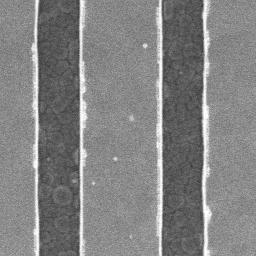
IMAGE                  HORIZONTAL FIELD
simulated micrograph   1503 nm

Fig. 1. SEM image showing one or a few lines or trenches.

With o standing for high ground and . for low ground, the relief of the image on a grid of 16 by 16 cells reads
oo...ooooo...ooo
oo...ooooo...ooo
oo...ooooo...ooo
oo...ooooo...ooo
oo...ooooo...ooo
oo...ooooo...ooo
oo...ooooo...ooo
oo...ooooo...ooo
oo...ooooo...ooo
oo...ooooo...ooo
oo...ooooo...ooo
oo...ooooo...ooo
oo...ooooo...ooo
oo...ooooo...ooo
oo...ooooo...ooo
oo...ooooo...ooo